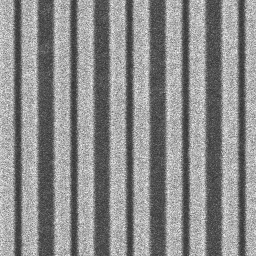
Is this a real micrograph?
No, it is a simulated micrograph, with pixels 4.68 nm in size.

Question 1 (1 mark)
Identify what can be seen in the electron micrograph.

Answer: parallel lines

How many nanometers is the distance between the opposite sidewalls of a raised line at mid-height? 72.5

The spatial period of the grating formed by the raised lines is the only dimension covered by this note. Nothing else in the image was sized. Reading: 134 nanometres